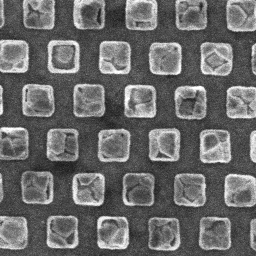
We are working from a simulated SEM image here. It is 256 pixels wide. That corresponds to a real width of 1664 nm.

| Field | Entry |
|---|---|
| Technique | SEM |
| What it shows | a regular array of raised bodies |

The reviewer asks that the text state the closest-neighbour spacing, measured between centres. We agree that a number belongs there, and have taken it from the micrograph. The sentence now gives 0.325 micrometres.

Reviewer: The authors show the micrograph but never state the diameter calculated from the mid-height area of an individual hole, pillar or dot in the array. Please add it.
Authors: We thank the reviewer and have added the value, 207 nanometres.